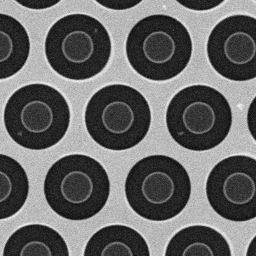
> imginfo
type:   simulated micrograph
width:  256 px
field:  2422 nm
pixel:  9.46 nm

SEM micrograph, an array of small figures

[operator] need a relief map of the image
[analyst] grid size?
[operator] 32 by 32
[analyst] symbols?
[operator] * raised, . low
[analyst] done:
**.....*****.....*****......****
********************************
..*****.....******....******....
...***.......****......****.....
....**........**...**...**......
....**........**..****..**......
....**........**..****..**......
...***........**...**...**......
...***.......***.......****.....
..******....******....******....
****..********.*****************
**......****.....*****.....*****
*.......***.......***.......****
*........**........**........**.
.........*.........**........**.
*........**........**........**.
*.......***.......***........**.
**......****......****......****
***...*******...*******....*****
.*******...********..********..*
..*****......****......****.....
...***.......***.......***......
....**........**........**......
....*.........**........**......
...***........**........**......
...***.......***.......***......
..*****.....*****......****.....
*********.*********..********..*
**.....******....******....*****
*.......***.......****......****
*.......***.......***........**.
.........*.........**........**.